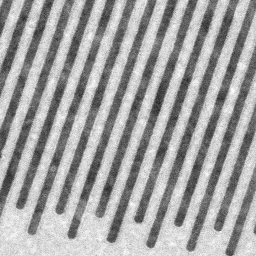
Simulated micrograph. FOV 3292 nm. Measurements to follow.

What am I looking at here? parallel lines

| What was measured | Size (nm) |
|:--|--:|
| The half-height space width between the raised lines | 114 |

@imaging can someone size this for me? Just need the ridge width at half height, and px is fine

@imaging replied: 10.3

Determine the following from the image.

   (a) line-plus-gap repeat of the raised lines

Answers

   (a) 250 nanometers